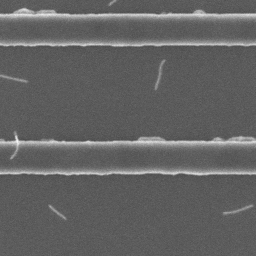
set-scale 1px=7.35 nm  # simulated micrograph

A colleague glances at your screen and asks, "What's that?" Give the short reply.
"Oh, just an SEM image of lines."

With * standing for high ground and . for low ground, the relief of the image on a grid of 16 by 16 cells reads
................
****************
****************
................
................
................
................
................
................
****************
****************
................
................
................
................
................